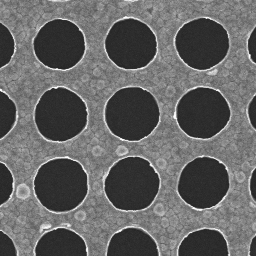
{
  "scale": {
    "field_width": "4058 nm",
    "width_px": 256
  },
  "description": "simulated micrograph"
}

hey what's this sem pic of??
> a regular array of holes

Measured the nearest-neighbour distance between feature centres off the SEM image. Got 1.11 µm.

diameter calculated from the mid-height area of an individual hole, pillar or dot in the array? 52.2 px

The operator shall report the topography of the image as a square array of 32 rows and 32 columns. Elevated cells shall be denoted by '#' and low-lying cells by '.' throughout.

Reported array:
################################
################################
#######.#######..#######..######
.####.....####.....####.....####
..##......###......###......###.
..##.......##.......##.......##.
..##.......##.......##......###.
.####.....####.....####.....####
#######..######..#######..######
################################
################################
######...######....#####...#####
.####.....####.....####.....###.
..##.......##.......##.......##.
..##.......##.......##.......##.
..###......##.......##......###.
.####.....####.....####....#####
######..########.###############
################################
################################
######....####.....####.....####
.####......###.....####.....####
..##.......##.......##.......##.
..##.......##.......##.......##.
.####......##......####.....###.
#####.....####.....#####...#####
#######.########################
################################
################.###############
.####.....####.....####.....####
..###......###......###.....###.
..##.......##.......##......###.